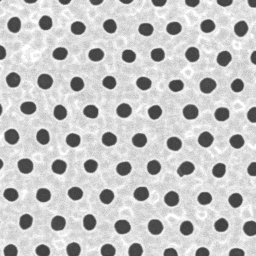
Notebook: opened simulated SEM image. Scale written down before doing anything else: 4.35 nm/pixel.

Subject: a regular array of holes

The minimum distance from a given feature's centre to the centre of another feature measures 135 nm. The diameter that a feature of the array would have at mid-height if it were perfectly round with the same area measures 64.2 nanometers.